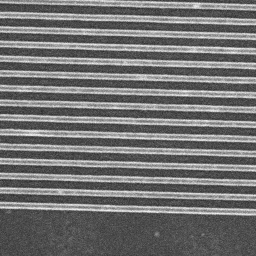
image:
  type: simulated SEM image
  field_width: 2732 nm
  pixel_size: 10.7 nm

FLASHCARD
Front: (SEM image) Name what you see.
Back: parallel lines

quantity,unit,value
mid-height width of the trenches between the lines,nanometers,97.3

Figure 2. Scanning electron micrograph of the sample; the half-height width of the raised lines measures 58.7 nm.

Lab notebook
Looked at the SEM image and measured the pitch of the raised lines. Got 156 nm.